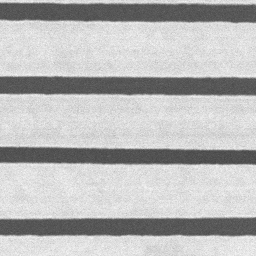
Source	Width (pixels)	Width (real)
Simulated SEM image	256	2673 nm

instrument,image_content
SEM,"lines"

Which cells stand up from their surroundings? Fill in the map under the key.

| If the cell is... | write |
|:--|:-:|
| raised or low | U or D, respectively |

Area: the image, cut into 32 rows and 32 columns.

DDDDDDDDDDDDDDDDDDDDDDDDDDDDDDUD
DDDDDDDDDDDDDDDDDDDDDDDDDDDDDDDD
DDDDDDDDDDDDDDDDDDDDDDDDDDDDDDDD
UUUUUUUUUUUUUUUUUUUUUUUUUUUUUUUU
UUUUUUUUUUUUUUUUUUUUUUUUUUUUUUUU
UUUUUUUUUUUUUUUUUUUUUUUUUUUUUUUU
UUUUUUUUUUUUUUUUUUUUUUUUUUUUUUUU
UUUUUUUUUUUUUUUUUUUUUUUUUUUUUUUU
UUUUUUUUUUUUUUUUUUUUUUUUUUUUUUUU
DDDDDDDDDDDUUUDDUUUUUUUUUUUUUUUU
DDDDDDDDDDDDDDDDDDDDDDDDDDDDDDDD
DDDDDDDDDDDDDDDDDDDDDDDDDDDDDDDD
UUUUUUUUUUUUUUUUUUUUUUUUUUUUUUUU
UUUUUUUUUUUUUUUUUUUUUUUUUUUUUUUU
UUUUUUUUUUUUUUUUUUUUUUUUUUUUUUUU
UUUUUUUUUUUUUUUUUUUUUUUUUUUUUUUU
UUUUUUUUUUUUUUUUUUUUUUUUUUUUUUUU
UUUUUUUUUUUUUUUUUUUUUUUUUUUUUUUU
DDDDDDDDDDDDUUUUUUUUUUUUUUUUUUUU
DDDDDDDDDDDDDDDDDDDDDDDDDDDDDDDD
UUUUDDDDDDDDDDDDDDDDDDDDDDDDDDDD
UUUUUUUUUUUUUUUUUUUUUUUUUUUUUUUU
UUUUUUUUUUUUUUUUUUUUUUUUUUUUUUUU
UUUUUUUUUUUUUUUUUUUUUUUUUUUUUUUU
UUUUUUUUUUUUUUUUUUUUUUUUUUUUUUUU
UUUUUUUUUUUUUUUUUUUUUUUUUUUUUUUU
UUUUUUUUUUUUUUUUUUUUUUUUUUUUUUUU
DDDDDDDDDDDDDDDDDDDDDDDDDDDDDDDD
DDDDDDDDDDDDDDDDDDDDDDDDDDDDDDDD
UUDUUDDDUUUDUUDUUDDDDUUDDDDDDDDD
UUUUUUUUUUUUUUUUUUUUUUUUUUUUUUUU
UUUUUUUUUUUUUUUUUUUUUUUUUUUUUUUU